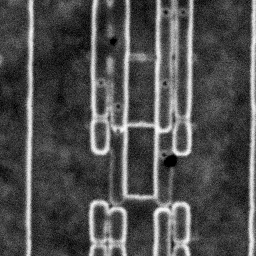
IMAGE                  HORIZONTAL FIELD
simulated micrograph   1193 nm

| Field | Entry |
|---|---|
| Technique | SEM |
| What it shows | wiring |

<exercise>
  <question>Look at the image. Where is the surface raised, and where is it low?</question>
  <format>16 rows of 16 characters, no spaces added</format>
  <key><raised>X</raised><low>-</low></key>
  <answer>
XX----XX--XX----
XX----XX--XX----
XX----XX--XX----
XX----XX--XX----
XX----XX--XX----
XX----XX--XX----
XX----XX--XX----
XX----XX--XX----
XX----X----X----
XX---------X----
XX--------------
XX--------------
XX--------------
XX----XX--XX----
XX----XX--XX----
XX----XX--XX----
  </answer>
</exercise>